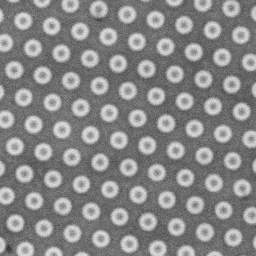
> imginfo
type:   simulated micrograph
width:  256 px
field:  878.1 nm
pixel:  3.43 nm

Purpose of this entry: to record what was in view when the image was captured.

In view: an array of small figures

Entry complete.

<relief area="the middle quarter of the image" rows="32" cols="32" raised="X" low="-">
-----XX-----XXXX---XXXX---------
------------XXX----XXXX---XXXX--
XXX----------------XXX----XXXX--
XXXX----XX----------------XXXX--
XXXX---XXXX----------------XX---
XXX----XXXX---XXXX--------------
-------XXXX---XXXX----XXX-------
--------XX----XXXX---XXXX----XX-
---------------XX----XXXX---XXXX
---XXX---------------XXXX---XXXX
--XXXX----XX----------------XXXX
--XXXX---XXXX-------------------
---XXX---XXXX----XXX------------
----------XXX---XXXX----XXX-----
----------------XXXX---XXXXX---X
X----------------XX----XXXXX---X
XX---XXX----------------XXX----X
X----XXXX---XXX----------------X
-----XXXX---XXXX----XX----------
-----XXX----XXXX---XXXX---------
------------XXX----XXXX---XXXX--
-XX----------------XXXX---XXXX--
XXXX----------------------XXXX--
XXXX---XXXX----------------XX---
XXXX---XXXX---XXXX--------------
-------XXXX---XXXX----XX--------
--------XX----XXXX---XXXX-----X-
---------------XXX---XXXX---XXXX
---XXX----------------XXX---XXXX
--XXXX----XX----------------XXXX
--XXXX----XXX-----------------X-
---XXX---XXXXX---XXX------------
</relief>